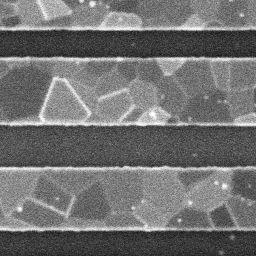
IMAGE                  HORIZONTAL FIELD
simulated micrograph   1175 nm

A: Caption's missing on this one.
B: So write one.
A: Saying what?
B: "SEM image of lines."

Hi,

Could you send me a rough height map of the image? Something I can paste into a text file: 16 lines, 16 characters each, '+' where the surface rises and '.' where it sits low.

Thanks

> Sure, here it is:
++++++++++++++++
++++++++++++++++
................
................
++++++++++++++++
++++++++++++++++
++++++++++++++++
++++++++++++++++
................
................
++++++++++++++++
++++++++++++++++
++++++++++++++++
++++++++++++++++
................
................